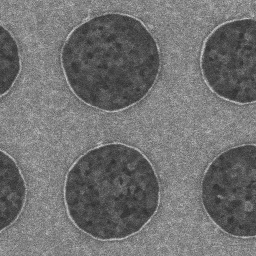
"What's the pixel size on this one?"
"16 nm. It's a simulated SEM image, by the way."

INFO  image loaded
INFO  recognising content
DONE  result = raised bodies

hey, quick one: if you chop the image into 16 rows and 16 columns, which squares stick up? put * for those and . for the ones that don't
................
.....****.....**
*...******...***
*...******...***
*...******...***
*...*****....***
......**........
................
................
.....****.....**
*...******...***
**..******...***
**..******...***
*...*****....***
.....***......**
................